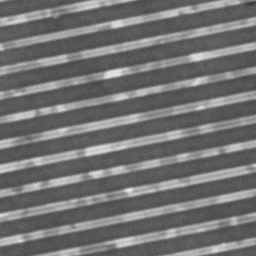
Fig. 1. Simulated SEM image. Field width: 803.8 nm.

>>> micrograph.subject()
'parallel lines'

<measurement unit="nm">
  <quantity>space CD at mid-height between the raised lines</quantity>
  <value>56.7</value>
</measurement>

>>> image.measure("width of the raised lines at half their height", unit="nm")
18.5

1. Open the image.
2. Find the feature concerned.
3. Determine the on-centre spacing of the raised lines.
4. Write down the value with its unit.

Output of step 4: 0.0754 um